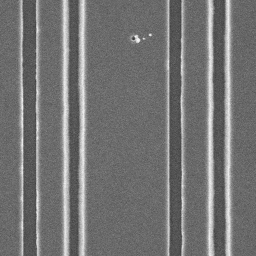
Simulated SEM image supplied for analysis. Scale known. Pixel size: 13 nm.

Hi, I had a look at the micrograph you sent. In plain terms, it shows lines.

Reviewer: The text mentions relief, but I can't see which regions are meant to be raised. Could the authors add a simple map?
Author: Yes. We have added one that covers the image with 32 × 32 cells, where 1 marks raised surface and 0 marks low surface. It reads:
11100111001111111111100111001111
11100111001111111111100111001111
11100111001111111111100111001111
11100111001111111111100111001111
11100111001111111111100111001111
11100111001111111111100111001111
11100111001111111111100111001111
11100111001111111111100111001111
11100111001111111111100111001111
11100111001111111111100111001111
11100111001111111111100111001111
11100111001111111111100111001111
11100111001111111111100111001111
11100111001111111111100111001111
11100111001111111111100111001111
11100111001111111111100111000111
11100111001111111111100111000111
11100111001111111111100111001111
11100111001111111111100111001111
11100111001111111111100111001111
11100111001111111111100111001111
11100111001111111111100111001111
11100111001111111111100111001111
11100111001111111111100111001111
11100111001111111111100111001111
11100111001111111111100111000111
11100111001111111111100111000111
11100111001111111111100111000111
11100111001111111111100111000111
11100111001111111111100111000111
11100111001111111111100111000111
11100111001111111111100111000111